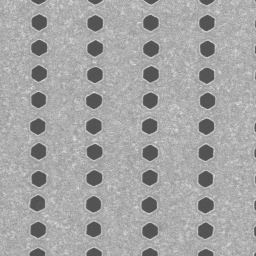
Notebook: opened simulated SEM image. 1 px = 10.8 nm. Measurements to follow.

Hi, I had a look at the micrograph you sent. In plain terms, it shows a regular array of holes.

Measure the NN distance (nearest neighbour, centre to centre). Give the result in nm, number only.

275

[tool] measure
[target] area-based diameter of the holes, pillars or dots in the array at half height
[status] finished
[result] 169 nm